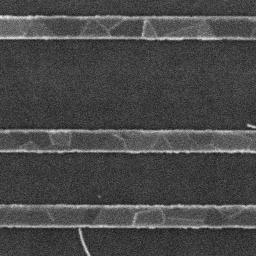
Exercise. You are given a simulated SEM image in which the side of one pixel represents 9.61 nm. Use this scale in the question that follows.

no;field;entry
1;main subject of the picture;lines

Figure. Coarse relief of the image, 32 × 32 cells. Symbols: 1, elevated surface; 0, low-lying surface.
00000000000000000000000000000000
00000000000000000000000000000000
11111111111111111111111111111111
11111111111111111111111111111111
11111111111111111111111111111111
00000000000000000000000000000000
00000000000000000000000000000000
00000000000000000000000000000000
00000000000000000000000000000000
00000000000000000000000000000000
00000000000000000000000000000000
00000000000000000000000000000000
00000000000000000000000000000000
00000000000000000000000000000000
00000000000000000000000000000000
00000000000000000000000000000000
11111111111111111111111111111111
11111111111111111111111111111111
11111111111111111111111111111111
00000000000000000000000000000000
00000000000000000000000000000000
00000000000000000000000000000000
00000000000000000000000000000000
00000000000000000000000000000000
00000000000000000000000000000000
00000000000000000000000000000000
11111111111111111111111111111111
11111111111111111111111111111111
00000000000000000000000000000000
00000000000000000000000000000000
00000000000000000000000000000000
00000000000000000000000000000000